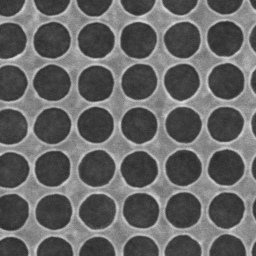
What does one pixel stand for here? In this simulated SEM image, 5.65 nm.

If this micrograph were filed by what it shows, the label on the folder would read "a regular array of holes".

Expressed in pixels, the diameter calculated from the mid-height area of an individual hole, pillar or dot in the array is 37.1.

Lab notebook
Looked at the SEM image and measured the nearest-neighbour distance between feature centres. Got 0.24 um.